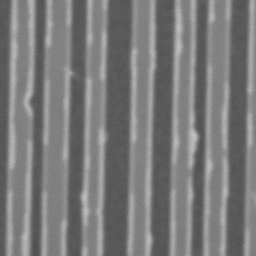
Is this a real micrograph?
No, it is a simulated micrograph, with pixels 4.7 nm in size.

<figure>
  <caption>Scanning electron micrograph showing parallel lines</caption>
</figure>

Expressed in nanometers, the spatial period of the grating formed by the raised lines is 184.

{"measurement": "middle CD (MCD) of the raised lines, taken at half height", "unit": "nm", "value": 99.2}